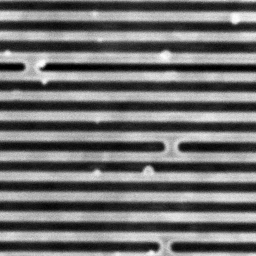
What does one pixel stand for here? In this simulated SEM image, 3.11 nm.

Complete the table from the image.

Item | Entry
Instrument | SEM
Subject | parallel lines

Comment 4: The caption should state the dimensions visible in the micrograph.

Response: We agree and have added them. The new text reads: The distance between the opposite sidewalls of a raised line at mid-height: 9.39 pixels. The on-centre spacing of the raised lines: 62.4 nanometres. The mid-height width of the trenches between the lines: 10.9 pixels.